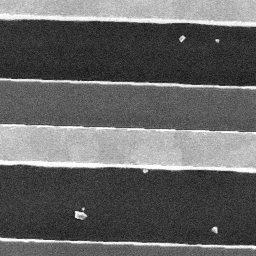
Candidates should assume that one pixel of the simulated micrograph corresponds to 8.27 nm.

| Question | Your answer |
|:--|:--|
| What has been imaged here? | lines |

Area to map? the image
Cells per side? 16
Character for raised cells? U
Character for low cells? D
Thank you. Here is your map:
UUUUUUUUUUUUUUUU
DDDDDDDDDDDDDDDD
DDDDDDDDDDDDDDDD
DDDDDDDDDDDDDDDD
DDDDDDDDDDDDDDDD
UUUUUUUUUUUUUUUU
UUUUUUUUUUUUUUUU
UUUUUUUUUUUUUUUU
UUUUUUUUUUUUUUUU
UUUUUUUUUUUUUUUU
DDDDDDDDDDDDDDUU
DDDDDDDDDDDDDDDD
DDDDDDDDDDDDDDDD
DDDDDDDDDDDDDDDD
DDDDDDDDDDDDDDDD
UUUUUUUUUUUUUUUU